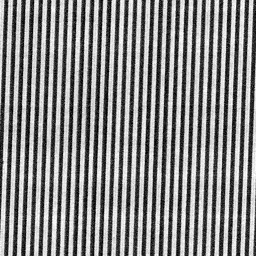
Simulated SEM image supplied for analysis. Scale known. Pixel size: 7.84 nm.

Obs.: parallel lines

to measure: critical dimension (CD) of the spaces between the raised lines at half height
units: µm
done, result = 0.047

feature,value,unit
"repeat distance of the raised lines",67.3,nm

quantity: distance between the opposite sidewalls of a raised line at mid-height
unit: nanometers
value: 20.6